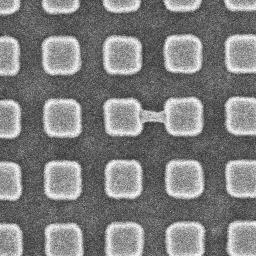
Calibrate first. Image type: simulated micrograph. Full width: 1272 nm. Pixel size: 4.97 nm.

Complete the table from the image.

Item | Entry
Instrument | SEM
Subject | raised bodies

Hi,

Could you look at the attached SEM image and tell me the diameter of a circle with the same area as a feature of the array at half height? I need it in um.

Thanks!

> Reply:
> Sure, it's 0.194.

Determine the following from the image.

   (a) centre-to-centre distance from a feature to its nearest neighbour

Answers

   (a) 302 nm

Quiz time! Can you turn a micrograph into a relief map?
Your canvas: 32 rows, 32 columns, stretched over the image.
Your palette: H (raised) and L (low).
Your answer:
HHLLLHHHHHLLLHHHHLLLLHHHHLLLHHHH
HHLLLLHLHLLLLLLLLLLLLLLLLLLLLLLL
LLLLLLLLLLLLLLLLLLLLLLLLLLLLLLLL
LLLLLLLLLLLLLLLLLLLLLLLLLLLLLLLL
LLLLLLLLLLLLLLLLLLLLLLLHLLLLLLHH
HHLLLLHHHHLLLHHHHLLLLHHHHLLLHHHH
HHLLLHHHHHLLLHHHHHLLLHHHHLLLHHHH
HHLLLHHHHHLLLHHHHLLLLHHHHLLLHHHH
HHLLLLHHHHLLLHHHHLLLLHHHHLLLLHHH
LLLLLLLLLLLLLLLLLLLLLLLLLLLLLLLL
LLLLLLLLLLLLLLLLLLLLLLLLLLLLLLLL
LLLLLLLLLLLLLLLLLLLLLLLLLLLLLLLL
LLLLLLLLLLLLLLLLLLLLLHHHHLLLLHHH
HHLLLLHHHHLLLHHHHHLLLHHHHLLLHHHH
HHLLLLHHHHLLLHHHHHHHHHHHHLLLHHHH
HHLLLLHHHHLLLHHHHHLLLHHHHLLLHHHH
HHLLLLHHHHLLLLHHHLLLLHHHHLLLLHHH
LLLLLLLLLLLLLLLLLLLLLLLLLLLLLLLL
LLLLLLLLLLLLLLLLLLLLLLLLLLLLLLLL
LLLLLLLLLLLLLLLLLLLLLLLLLLLLLLLL
HHLLLLHHHLLLLLHHHLLLLHHHHLLLLHHH
HHLLLLHHHHLLLHHHHHLLLHHHHLLLHHHH
HHLLLLHHHHLLLHHHHHLLLHHHHLLLHHHH
HHHLLLHHHHLLLHHHHHLLLHHHHLLLHHHH
HHLLLLHHHHLLLLHHHLLLLLHHLLLLLHHH
LLLLLLLLLLLLLLLLLLLLLLLLLLLLLLLL
LLLLLLLLLLLLLLLLLLLLLLLLLLLLLLLL
LLLLLLLLLLLLLLLLLLLLLLLLLLLLLLLL
HHLLLLHHHHLLLLHHHHLLLHHHHLLLLHHH
HHHLLLHHHHLLLHHHHHLLLHHHHLLLLHHH
HHHLLLHHHHLLLHHHHHLLLHHHHLLLLHHH
HHHLLLHHHHLLLHHHHHLLLHHHHLLLLHHH